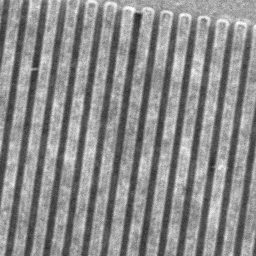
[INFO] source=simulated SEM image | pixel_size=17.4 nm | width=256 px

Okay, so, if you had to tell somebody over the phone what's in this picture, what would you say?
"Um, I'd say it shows parallel lines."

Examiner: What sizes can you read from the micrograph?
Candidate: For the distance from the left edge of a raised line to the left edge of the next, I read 327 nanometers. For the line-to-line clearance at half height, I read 140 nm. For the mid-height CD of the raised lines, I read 185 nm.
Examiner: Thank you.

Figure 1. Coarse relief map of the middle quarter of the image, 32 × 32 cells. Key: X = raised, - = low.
X---XX--XXX--XXX--XX---XX--XXX--
X--XXX--XXX--XX---XX---XX--XXX--
X--XXX--XXX--XX---XX--XXX--XX---
X--XXX--XX---XX--XXX--XXX--XX---
X--XX---XX--XXX--XXX--XXX--XX---
X--XX---XX--XXX--XXX--XX---XX--X
---XX--XXX--XXX--XXX--XX---XX--X
---XX--XXX--XXX--XX---XX--XXX--X
--XXX--XXX--XX---XX---XX--XXX--X
--XXX--XXX--XX--XXX--XXX--XXX--X
--XXX--XX---XX--XXX--XXX--XXX--X
--XX---XX--XXX--XXX--XXX--XX---X
--XX---XX--XXX--XXX--XXX--XX--XX
--XX--XXX--XXX--XXX--XX---XX--XX
--XX--XXX--XXX--XX---XX--XXX--XX
-XXX--XXX--XX---XX---XX--XXX--XX
-XXX--XXX--XX--XXX--XXX--XXX--XX
-XXX--XX---XX--XXX--XXX--XXX--XX
-XX---XX--XXX--XXX--XXX--XX---XX
-XX---XX--XXX--XXX--XX---XX--XXX
-XX--XXX--XXX--XX---XX---XX--XXX
-XX--XXX--XXX--XX---XX--XXX--XXX
XXX--XXX--XX---XX---XX--XXX--XXX
XXX--XXX--XX---XX--XXX--XXX--XX-
XXX--XX---XX--XXX--XXX--XXX--XX-
XX---XX--XXX--XXX--XXX--XX---XX-
XX---XX--XXX--XXX--XX---XX--XXX-
XX--XXX--XXX--XXX--XX---XX--XXX-
XX--XXX--XXX--XX---XX--XXX--XXX-
XX--XXX--XX---XX---XX--XXX--XXX-
XX--XXX--XX---XX--XXX--XXX--XX--
XX--XX---XX--XXX--XXX--XXX--XX--